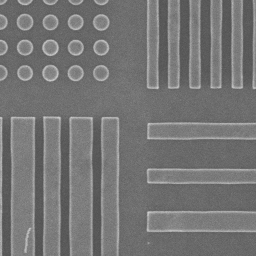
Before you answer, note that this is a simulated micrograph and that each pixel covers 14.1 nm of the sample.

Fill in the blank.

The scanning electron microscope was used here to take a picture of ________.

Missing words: groups of lines, slits or small figures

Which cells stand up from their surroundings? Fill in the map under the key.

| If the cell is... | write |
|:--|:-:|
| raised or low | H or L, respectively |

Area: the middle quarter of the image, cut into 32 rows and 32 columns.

LLHHLLLLHHLLLLLLLLLLLHHLLLHHHLLH
LHHHHLLLHHHLLLLLLLLLLHHLLLHHHLLH
LHHHHLLLHHHLLLLLLLLLLHHHLLHHHLLH
LHHHLLLLHHHLLLLLLLLLLHHHLLHHHLLH
LLLLLLLLLLLLLLLLLLLLLHHHLLHHHLLH
LLLLLLLLLLLLLLLLLLLLLHHHLLHHHLLH
LLLLLLLLLLLLLLLLLLLLLLLLLLLLLLLL
LLLLLLLLLLLLLLLLLLLLLLLLLLLLLLLL
LLLLLLLLLLLLLLLLLLLLLLLLLLLLLLLL
LLLLLLLLLLLLLLLLLLLLLLLLLLLLLLLL
LLLLLLLLLLLLLLLLLLLLLLLLLLLLLLLL
LLLLLLLLLLLLLLLLLLLLLLLLLLLLLLLL
LLLLLLLLLLLLLLLLLLLLLLLLLLLLLLLL
LLHHHHHLLLHHHLLLLLLLLLLLLLLLLLLL
LLHHHHHLLHHHHHLLLLLLLLLLLLLLLLLL
LLHHHHHLLHHHHHLLLLLLLHHHHHHHHHHH
LLHHHHHLLHHHHHLLLLLLLHHHHHHHHHHH
LLHHHHHLLHHHHHLLLLLLLHHHHHHHHHHH
LLHHHHHLLHHHHHLLLLLLLHHHHHHHHHHH
LLHHHHHLLHHHHHLLLLLLLLLLLLLLLLLL
LLHHHHHLLHHHHHLLLLLLLLLLLLLLLLLL
LLHHHHHLLHHHHHLLLLLLLLLLLLLLLLLL
LLHHHHHLLLHHHHLLLLLLLLLLLLLLLLLL
LLHHHHHLLLHHHHLLLLLLLLLLLLLLLLLL
LLHHHHHLLLHHHHLLLLLLLLLLLLLLLLLL
LLHHHHHLLLHHHHLLLLLLLLLLLLLLLLLL
LLHHHHHLLLHHHHLLLLLLLHHHHHHHHHHH
LLHHHHHLLHHHHHLLLLLLLHHHHHHHHHHH
LLHHHHHLLHHHHHLLLLLLLHHHHHHHHHHH
LLHHHHHLLHHHHLLLLLLLLHHHHHHHHHHH
LLHHHHHLLHHHHLLLLLLLLLLLLLLLLLLL
LLHHHHHLLHHHHLLLLLLLLLLLLLLLLLLL